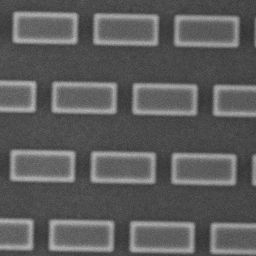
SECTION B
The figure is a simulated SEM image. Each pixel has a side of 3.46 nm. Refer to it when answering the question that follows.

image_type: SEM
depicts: groups of lines, slits or small figures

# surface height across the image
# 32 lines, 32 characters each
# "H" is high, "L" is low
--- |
LLLLLLLLLLLLLLLLLLLLLLLLLLLLLLLL
LLLLLLLLLLLLLLLLLLLLLLLLLLLLLLLL
LLHHHHHHHHLLHHHHHHHHLLHHHHHHHHLL
LLHHHHHHHHLLHHHHHHHHLLHHHHHHHHLL
LLHHHHHHHHLLHHHHHHHHLLHHHHHHHHLL
LLLLLLLLLLLLLLLLLLHLLLHHHHHHHHLL
LLLLLLLLLLLLLLLLLLLLLLLLLLLLLLLL
LLLLLLLLLLLLLLLLLLLLLLLLLLLLLLLL
LLLLLLLLLLLLLLLLLLLLLLLLLLLLLLLL
LLLLLLLLLLLLLLLLLLLLLLLLLLLLLLLL
HHHHLLLHHLLLLLLLLLLLLLLLLLLLLLLL
HHHHLLLHHHHHHHLLLHHHHHHHLLLHHHHH
HHHHLLLHHHHHHHLLLHHHHHHHLLLHHHHH
HHHHLLLHHHHHHHLLLHHHHHHHLLLHHHHH
LLLLLLLLLLLLLLLLLLLLLLLLLLLLLLLL
LLLLLLLLLLLLLLLLLLLLLLLLLLLLLLLL
LLLLLLLLLLLLLLLLLLLLLLLLLLLLLLLL
LLLLLLLLLLLLLLLLLLLLLLLLLLLLLLLL
LLLLLLLLLLLLLLLLLLLLLLLLLLLLLLLL
LLHHHHHHHLLLHHHHHHHLLLHHHHHHHLLL
LHHHHHHHHLLLHHHHHHHLLLHHHHHHHLLL
LHHHHHHHHLLLHHHHHHHLLLHHHHHHHLLL
LLLLHHHHHLLLHHHHHHHLLLHHHHHHHLLL
LLLLLLLLLLLLLLLLLLLLLLLLLLLLLLLL
LLLLLLLLLLLLLLLLLLLLLLLLLLLLLLLL
LLLLLLLLLLLLLLLLLLLLLLLLLLLLLLLL
LLLLLLLLLLLLLLLLLLLLLLLLLLLLLLLL
HLLLLLLLLLLLLLLLLLLLLLLLLLLLLLLL
HHHHLLHHHHHHHHLLHHHHHHHHLLHHHHHH
HHHHLLHHHHHHHHLLHHHHHHHHLLHHHHHH
HHHHLLHHHHHHHHLLHHHHHHHHLLHHHHHH
LLLLLLLLLLLLLLLLLLLLLLLLLLLLHHHH